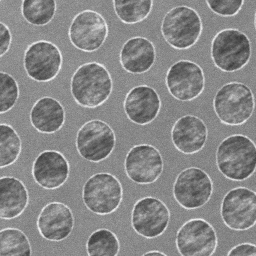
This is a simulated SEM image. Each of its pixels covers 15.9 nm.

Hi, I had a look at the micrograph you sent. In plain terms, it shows a regular array of holes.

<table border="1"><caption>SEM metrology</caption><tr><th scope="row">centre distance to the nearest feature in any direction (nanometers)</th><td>832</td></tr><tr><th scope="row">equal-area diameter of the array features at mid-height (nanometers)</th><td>600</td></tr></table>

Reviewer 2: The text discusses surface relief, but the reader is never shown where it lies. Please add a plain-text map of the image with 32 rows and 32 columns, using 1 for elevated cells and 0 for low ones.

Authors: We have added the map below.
11100001111111000001111111000011
11100001110011100001100011100011
11100011100001100011100001111111
01111111100001111111000001111111
01111111100001111111100001100001
01110011100001110001100011100001
01100001111111100001111111100001
11100000111111100001111111100001
11100001110001110001100001110011
01110001100000111111100001111111
00111111100000111111100001111011
00111111100000110001100001100001
00111001110001110000111011100000
01110000111111110000111111100000
11110000111111110001111011100001
11110000111001111111110001111011
00111111110000111111110000111111
00111111110000111111110000110001
00111111110000111001110001100000
00111000110001110000111111100000
01110000111111110000111111100000
11110000111111110000111001110001
00111000111000011001110000111111
00011101110000011111110000111111
00011111110000011111110000110000
00011100111000011000111001110000
00011000011100111000011111110000
11111000011111111000011111110000
11111000011111111000011000111001
00011100111000111101110000011111
00001111111000011111110000011111
00001111111000011111111000011000